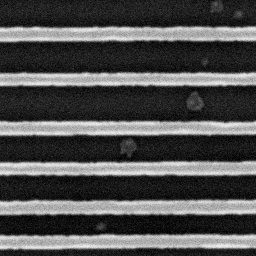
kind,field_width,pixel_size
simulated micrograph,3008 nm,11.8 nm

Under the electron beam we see lines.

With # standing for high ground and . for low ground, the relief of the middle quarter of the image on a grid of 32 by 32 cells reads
................................
................................
................................
################################
################################
................................
................................
................................
................................
................................
................................
................................
................................
................................
................................
################################
################################
................................
................................
................................
................................
................................
................................
................................
................................
################################
################################
########........................
................................
................................
................................
................................